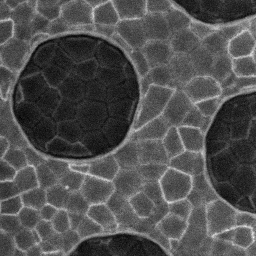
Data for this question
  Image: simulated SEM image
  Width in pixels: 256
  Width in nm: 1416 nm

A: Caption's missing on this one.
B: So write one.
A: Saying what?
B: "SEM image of holes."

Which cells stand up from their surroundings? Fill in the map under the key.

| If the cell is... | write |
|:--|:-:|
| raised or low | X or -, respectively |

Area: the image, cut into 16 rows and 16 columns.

XXXXXXXXXXX-----
XXXXXXXXXXXXX-XX
XXX----XXXXXXXXX
XX------XXXXXXXX
X--------XXXXXXX
X--------XXXXXXX
X--------XXXXX--
X-------XXXXX---
XX------XXXXX---
XX-----XXXXXX---
XXXXXXXXXXXXX---
XXXXXXXXXXXXX---
XXXXXXXXXXXXXX--
XXXXXXXXXXXXXXXX
XXXXXXXXXXXXXXXX
XXXXX-----XXXXXX